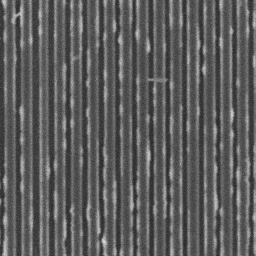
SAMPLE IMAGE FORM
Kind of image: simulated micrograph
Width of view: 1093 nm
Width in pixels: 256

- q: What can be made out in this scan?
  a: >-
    parallel lines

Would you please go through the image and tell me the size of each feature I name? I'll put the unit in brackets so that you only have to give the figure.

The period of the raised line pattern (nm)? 71.1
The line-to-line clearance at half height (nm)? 23.5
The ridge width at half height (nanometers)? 47.5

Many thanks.